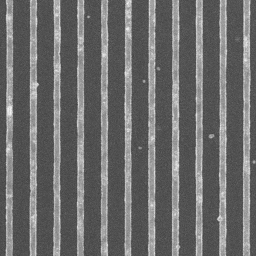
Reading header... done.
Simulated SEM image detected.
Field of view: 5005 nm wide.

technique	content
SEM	parallel lines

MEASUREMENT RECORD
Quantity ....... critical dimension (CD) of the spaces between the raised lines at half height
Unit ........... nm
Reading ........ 354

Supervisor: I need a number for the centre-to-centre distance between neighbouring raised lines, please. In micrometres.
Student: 0.464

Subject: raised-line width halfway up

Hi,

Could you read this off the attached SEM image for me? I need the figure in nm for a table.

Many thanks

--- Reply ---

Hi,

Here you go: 117